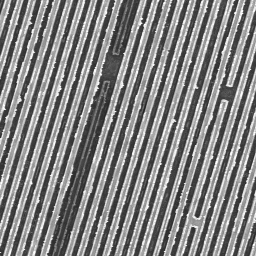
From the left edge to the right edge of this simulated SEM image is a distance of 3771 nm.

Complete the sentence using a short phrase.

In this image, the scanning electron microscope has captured parallel lines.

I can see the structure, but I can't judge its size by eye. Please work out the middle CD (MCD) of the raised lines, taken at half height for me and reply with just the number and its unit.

86.5 nm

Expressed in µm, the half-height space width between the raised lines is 0.0847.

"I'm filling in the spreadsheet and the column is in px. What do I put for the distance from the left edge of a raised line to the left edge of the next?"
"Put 11.8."